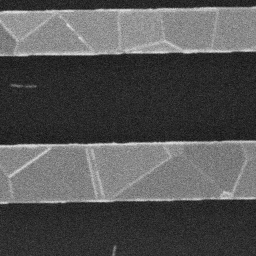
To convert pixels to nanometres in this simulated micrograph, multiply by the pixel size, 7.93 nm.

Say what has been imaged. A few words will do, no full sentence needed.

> lines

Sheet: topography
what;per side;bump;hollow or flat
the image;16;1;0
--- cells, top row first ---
0000000000000000
1111111111111111
1111111111111111
0000000000000000
0000000000000000
0000000000000000
0000000000000000
0000000000000000
0000000000000000
1111111111111111
1111111111111111
1111111111111111
1111111111100000
0000000000000000
0000000000000000
0000000000000000